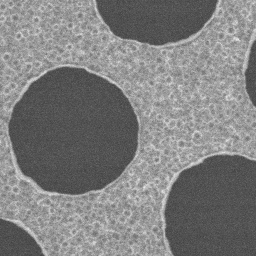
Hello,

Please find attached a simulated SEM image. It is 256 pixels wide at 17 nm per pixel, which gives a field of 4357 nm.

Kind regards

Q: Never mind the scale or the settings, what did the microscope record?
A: holes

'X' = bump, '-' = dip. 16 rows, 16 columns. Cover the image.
XXXXXX--------XX
XXXXXXX------XXX
XXXXXXXX----XXXX
XXXXXXXXXXXXXXX-
XXX---XXXXXXXXX-
XX-----XXXXXXXX-
X-------XXXXXXXX
X--------XXXXXXX
X--------XXXXXXX
X--------XXXXXXX
X-------XXXX----
XX-----XXXX-----
XXXXXXXXXX------
XXXXXXXXXX------
--XXXXXXXX------
---XXXXXXXX-----